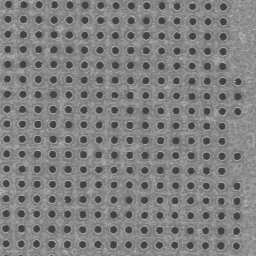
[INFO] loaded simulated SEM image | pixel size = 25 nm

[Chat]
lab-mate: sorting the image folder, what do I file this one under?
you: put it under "a regular array of holes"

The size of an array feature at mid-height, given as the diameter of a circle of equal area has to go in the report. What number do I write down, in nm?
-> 187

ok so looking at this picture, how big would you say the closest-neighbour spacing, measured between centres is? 371 nanometers